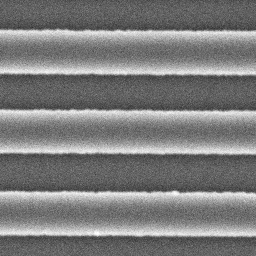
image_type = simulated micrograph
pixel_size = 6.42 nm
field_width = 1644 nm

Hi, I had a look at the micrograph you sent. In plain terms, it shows lines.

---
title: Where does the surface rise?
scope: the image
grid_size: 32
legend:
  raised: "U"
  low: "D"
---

DDDDDDDDDDDDDDDDDDDDDDDDDDDDDDDD
DDDDDDDDDDDDDDDDDDDDDDDDDDDDDDDD
DDDDDDDDDDDDDDDDDDDDDDDDDDDDDDDD
DDDDDDDDDDDDDDDDDDDDDDDDDDDDDDDD
UUUUUUUUUUUUUUUUUUUUUUUUUUUUUUUU
UUUUUUUUUUUUUUUUUUUUUUUUUUUUUUUU
UUUUUUUUUUUUUUUUUUUUUUUUUUUUUUUU
UUUUUUUUUUUUUUUUUUUUUUUUUUUUUUUU
UUUUUUUUUUUUUUUUUUUUUUUUUUUUUUUU
DDDDDDDDDDDDDDDDDDDDDDDDDDDDDDDD
DDDDDDDDDDDDDDDDDDDDDDDDDDDDDDDD
DDDDDDDDDDDDDDDDDDDDDDDDDDDDDDDD
DDDDDDDDDDDDDDDDDDDDDDDDDDDDDDDD
DDDDDDDDDDDDDDDDDDDDDDDDDDDDDDDD
UUUUUUUUUUUUUUUUUUUUUUUUUUUUUUUU
UUUUUUUUUUUUUUUUUUUUUUUUUUUUUUUU
UUUUUUUUUUUUUUUUUUUUUUUUUUUUUUUU
UUUUUUUUUUUUUUUUUUUUUUUUUUUUUUUU
UUUUUUUUUUUUUUUUUUUUUUUUUUUUUUUU
DDDDDDDDDDDDDDDDDDDDDDDDDDDDDDDD
DDDDDDDDDDDDDDDDDDDDDDDDDDDDDDDD
DDDDDDDDDDDDDDDDDDDDDDDDDDDDDDDD
DDDDDDDDDDDDDDDDDDDDDDDDDDDDDDDD
DDDDDDDDDDDDDDDDDDDDDDDDDDDDDDDD
UUUUUUUUUUUUUUUUUUUUUUUUUUUUUUUU
UUUUUUUUUUUUUUUUUUUUUUUUUUUUUUUU
UUUUUUUUUUUUUUUUUUUUUUUUUUUUUUUU
UUUUUUUUUUUUUUUUUUUUUUUUUUUUUUUU
UUUUUUUUUUUUUUUUUUUUUUUUUUUUUUUU
DDDDDDDDDDDDDDDDDDDDDDDDDDDDDDDD
DDDDDDDDDDDDDDDDDDDDDDDDDDDDDDDD
DDDDDDDDDDDDDDDDDDDDDDDDDDDDDDDD